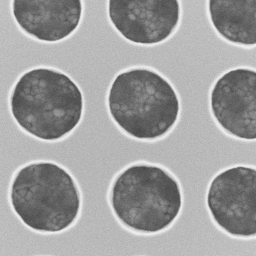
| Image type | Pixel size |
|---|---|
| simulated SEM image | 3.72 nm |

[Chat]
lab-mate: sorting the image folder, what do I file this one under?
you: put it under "holes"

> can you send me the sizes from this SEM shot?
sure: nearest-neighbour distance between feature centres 350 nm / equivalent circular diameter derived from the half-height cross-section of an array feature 69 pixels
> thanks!